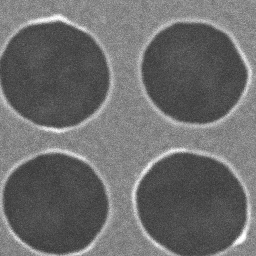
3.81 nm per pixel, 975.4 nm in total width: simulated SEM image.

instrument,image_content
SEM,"holes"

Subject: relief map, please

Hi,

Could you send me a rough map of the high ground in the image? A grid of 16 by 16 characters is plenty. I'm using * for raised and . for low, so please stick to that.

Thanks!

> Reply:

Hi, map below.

****************
**..*******..***
*.....***.....**
.......**......*
.......**.......
.......**......*
*.....****.....*
**...******...**
****************
***********.****
*.....***.....**
......***......*
.......*.......*
.......**......*
*.....***......*
**...*****....**